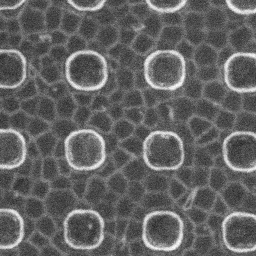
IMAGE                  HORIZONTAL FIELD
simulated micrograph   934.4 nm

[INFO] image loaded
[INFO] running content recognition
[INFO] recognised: raised bodies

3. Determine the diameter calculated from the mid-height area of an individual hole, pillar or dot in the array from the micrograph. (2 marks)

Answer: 144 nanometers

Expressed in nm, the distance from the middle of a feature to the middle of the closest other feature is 287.